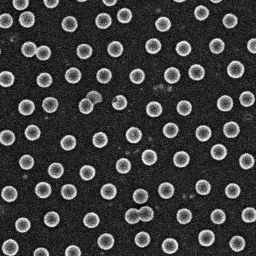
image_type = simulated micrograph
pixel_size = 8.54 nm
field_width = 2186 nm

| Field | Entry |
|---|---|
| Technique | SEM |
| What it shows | a regular array of raised bodies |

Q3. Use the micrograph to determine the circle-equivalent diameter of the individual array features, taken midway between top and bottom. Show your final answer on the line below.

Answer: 125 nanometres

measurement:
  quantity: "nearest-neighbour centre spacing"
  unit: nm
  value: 231